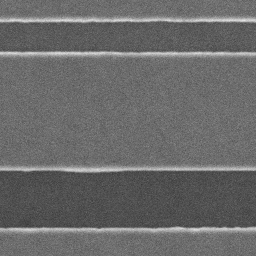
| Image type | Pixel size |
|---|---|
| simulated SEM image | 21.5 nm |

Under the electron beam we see lines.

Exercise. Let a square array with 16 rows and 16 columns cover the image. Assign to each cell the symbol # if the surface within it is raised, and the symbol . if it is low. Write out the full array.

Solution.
################
################
################
################
################
################
################
################
################
################
################
................
................
................
################
################